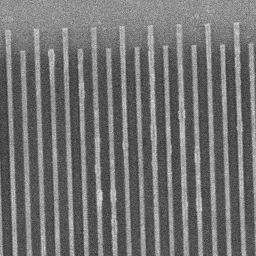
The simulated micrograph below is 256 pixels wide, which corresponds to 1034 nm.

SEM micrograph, parallel lines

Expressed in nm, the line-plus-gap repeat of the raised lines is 57.6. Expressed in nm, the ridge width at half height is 19.7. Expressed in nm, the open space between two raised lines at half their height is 39.3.